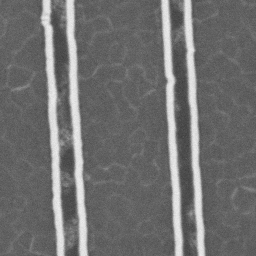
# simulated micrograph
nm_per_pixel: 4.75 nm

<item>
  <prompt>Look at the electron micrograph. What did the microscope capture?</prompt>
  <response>one or a few lines or trenches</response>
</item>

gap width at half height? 449 nm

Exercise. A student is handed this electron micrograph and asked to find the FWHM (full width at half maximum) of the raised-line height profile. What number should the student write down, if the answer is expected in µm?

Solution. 0.107